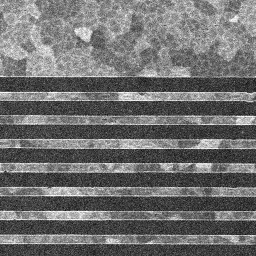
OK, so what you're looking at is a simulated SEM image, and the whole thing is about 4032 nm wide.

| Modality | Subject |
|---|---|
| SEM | parallel lines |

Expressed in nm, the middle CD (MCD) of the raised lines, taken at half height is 136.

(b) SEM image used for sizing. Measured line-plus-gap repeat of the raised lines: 375 nm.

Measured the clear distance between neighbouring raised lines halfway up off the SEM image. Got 242 nanometres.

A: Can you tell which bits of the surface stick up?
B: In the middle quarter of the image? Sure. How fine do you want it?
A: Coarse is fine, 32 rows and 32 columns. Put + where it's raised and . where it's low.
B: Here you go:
++++++++++++++++++++++.+++++++++
++++++++++++++++++++++++++++.+++
++.+++++++++++++++++++++++++++++
................................
................................
................................
................................
++++++++++++++++++++++++++++++++
++++++++++++++++++++++++++++++++
................................
................................
................................
................................
++++++++++.+++++++++++++++++++++
++++++++++.+++++++++++++++++++++
................................
................................
................................
................................
++++++++++++++++++++++++++++++++
++++++++++++++++++++++++++++++++
................................
................................
................................
................................
+++++++++++++++++.++++++++++++++
++++++++.+++++++++++++++++++++++
................................
................................
................................
................................
++++++++++++++++++++++++++++++++